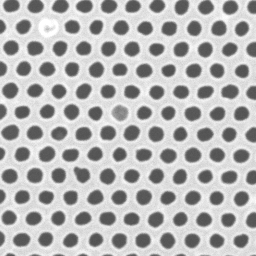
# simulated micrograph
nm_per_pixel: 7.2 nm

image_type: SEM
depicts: a regular array of holes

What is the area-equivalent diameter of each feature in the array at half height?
112 nanometers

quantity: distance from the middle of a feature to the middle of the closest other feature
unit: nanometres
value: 171